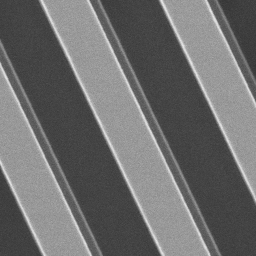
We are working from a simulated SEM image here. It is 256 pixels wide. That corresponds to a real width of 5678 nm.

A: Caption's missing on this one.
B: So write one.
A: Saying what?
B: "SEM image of lines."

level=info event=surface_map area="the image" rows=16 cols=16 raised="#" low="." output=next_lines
...###....####..
...####....###..
....###....####.
....####....###.
#....###....####
#....####....###
##....###....###
##....####....##
###....###....##
###....####....#
####....###....#
.###....####...#
.####...####....
..###....####...
..####...####...
..####....###...